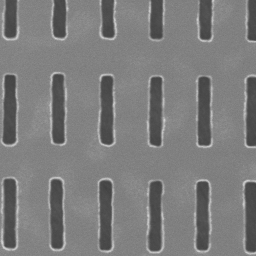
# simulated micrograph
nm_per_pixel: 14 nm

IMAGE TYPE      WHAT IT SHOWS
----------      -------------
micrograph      a regular array of holes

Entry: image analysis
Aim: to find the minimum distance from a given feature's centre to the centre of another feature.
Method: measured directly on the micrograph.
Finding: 678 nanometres